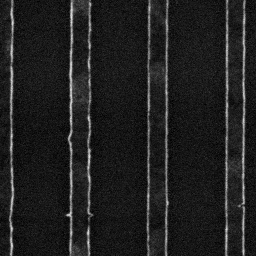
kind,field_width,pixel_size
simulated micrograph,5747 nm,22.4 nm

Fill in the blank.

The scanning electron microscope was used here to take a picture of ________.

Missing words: one or a few lines or trenches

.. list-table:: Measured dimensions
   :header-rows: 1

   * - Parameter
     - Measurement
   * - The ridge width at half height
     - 17.6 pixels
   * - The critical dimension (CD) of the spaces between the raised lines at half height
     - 1340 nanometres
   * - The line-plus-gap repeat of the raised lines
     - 1740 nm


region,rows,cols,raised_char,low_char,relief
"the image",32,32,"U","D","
UDDDDDDDDUUDDDDDDDDUUDDDDDDDUUUD
UDDDDDDDDUUDDDDDDDDUUDDDDDDDUUUD
UUDDDDDDDUUDDDDDDDDUUDDDDDDDUUUD
UUDDDDDDDUUDDDDDDDDUUDDDDDDDUUUD
UUDDDDDDDUUDDDDDDDDUUDDDDDDDUUUD
UDDDDDDDDUUDDDDDDDDUUDDDDDDDUUUD
UDDDDDDDDUUDDDDDDDDUUDDDDDDDUUUD
UDDDDDDDDUUDDDDDDDDUUDDDDDDDUUDD
UDDDDDDDDUUDDDDDDDDUUDDDDDDDUUDD
UDDDDDDDDUUDDDDDDDDUUDDDDDDDUUDD
UDDDDDDDDUUDDDDDDDDUUDDDDDDDUUDD
UDDDDDDDDUUDDDDDDDDUUDDDDDDDUUDD
UDDDDDDDDUUDDDDDDDDUUDDDDDDDUUDD
UDDDDDDDDUUDDDDDDDDUUDDDDDDDUUDD
UDDDDDDDDUUDDDDDDDDUUDDDDDDDUUDD
UDDDDDDDDUUDDDDDDDDUUDDDDDDDUUDD
UDDDDDDDDUUDDDDDDDDUUDDDDDDDUUDD
UDDDDDDDDUUDDDDDDDDUUDDDDDDDUUDD
UDDDDDDDDUUDDDDDDDDUUDDDDDDDUUDD
UDDDDDDDDUUDDDDDDDDUUDDDDDDDUUDD
UDDDDDDDDUUDDDDDDDDUUDDDDDDDUUDD
UUDDDDDDDUUDDDDDDDDUUDDDDDDDUUDD
UUDDDDDDDUUDDDDDDDDUUDDDDDDDUUDD
UDDDDDDDDUUDDDDDDDDUUDDDDDDDUUDD
UUDDDDDDDUUDDDDDDDDUUDDDDDDDUUDD
UDDDDDDDDUUDDDDDDDDUUDDDDDDDUUDD
UDDDDDDDDUUDDDDDDDUUUDDDDDDDUUDD
UDDDDDDDDUUDDDDDDDUUUDDDDDDDUUDD
UDDDDDDDDUUDDDDDDDUUUDDDDDDDUUDD
UDDDDDDDDUUDDDDDDDDUUDDDDDDDUUDD
UDDDDDDDDUUDDDDDDDUUUDDDDDDDUUDD
UDDDDDDDDUUDDDDDDDDUUDDDDDDDUUDD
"